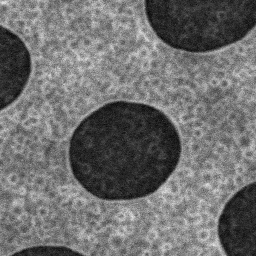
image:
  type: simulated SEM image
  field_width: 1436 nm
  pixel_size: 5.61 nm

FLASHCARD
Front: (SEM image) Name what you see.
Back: holes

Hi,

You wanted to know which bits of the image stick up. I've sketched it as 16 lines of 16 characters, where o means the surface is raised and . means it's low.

ooooooooo.......
ooooooooo.......
.ooooooooo.....o
..oooooooooooooo
..oooooooooooooo
..oooooooooooooo
.oooooo..ooooooo
ooooo......ooooo
oooo.......ooooo
oooo.......ooooo
oooo.......ooooo
ooooo.....oooooo
ooooooo.oooooo..
oooooooooooooo..
oooooooooooooo..
oo..oooooooooo..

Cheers